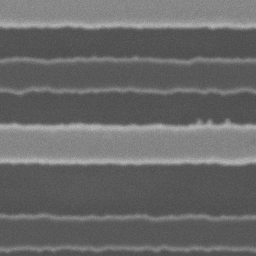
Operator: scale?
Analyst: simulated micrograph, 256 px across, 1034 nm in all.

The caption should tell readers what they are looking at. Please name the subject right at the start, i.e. lines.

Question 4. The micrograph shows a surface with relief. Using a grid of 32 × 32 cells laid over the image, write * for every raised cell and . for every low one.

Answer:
********************************
********************************
********************************
...........*.....*........*..***
................................
................................
................................
******.***************..********
********************************
********************************
********************************
.**....****.*.....****..******.*
................................
................................
................................
.*..........................*...
********************************
********************************
********************************
********************************
...............**...........***.
................................
................................
................................
................................
................................
................................
********************************
********************************
********************************
********************************
................................